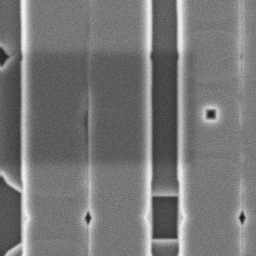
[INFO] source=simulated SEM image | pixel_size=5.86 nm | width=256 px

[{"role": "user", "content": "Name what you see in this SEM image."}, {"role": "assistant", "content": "wiring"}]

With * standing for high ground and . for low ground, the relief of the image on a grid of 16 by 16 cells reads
.********..*****
.********..*****
.********..*****
.********..*****
.********..*****
.********..*****
.********..*****
.********..*****
.********..*****
.********..*****
.********..*****
.********..*****
..*******..*****
..*******..*****
..*******..*****
.********..*****